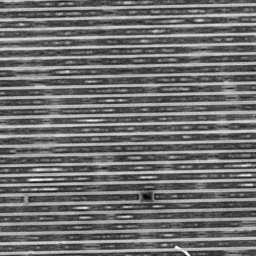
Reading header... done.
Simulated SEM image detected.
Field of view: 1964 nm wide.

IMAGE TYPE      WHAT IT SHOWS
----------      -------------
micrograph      parallel lines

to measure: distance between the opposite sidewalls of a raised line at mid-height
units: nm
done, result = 22.1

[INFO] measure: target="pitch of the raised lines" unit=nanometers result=74.6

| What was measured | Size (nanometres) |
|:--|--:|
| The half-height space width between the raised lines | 52.7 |